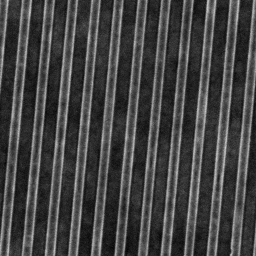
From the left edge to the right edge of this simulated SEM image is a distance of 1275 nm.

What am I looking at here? parallel lines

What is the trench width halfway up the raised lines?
72.6 nanometers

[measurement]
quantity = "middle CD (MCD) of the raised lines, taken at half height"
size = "0.044 micrometres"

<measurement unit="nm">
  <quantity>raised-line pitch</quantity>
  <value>115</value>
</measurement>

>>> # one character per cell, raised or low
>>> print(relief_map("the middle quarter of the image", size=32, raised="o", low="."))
oo....oo...oo....oo....oo....oo.
oo...oo....oo....oo....oo....oo.
oo...oo....oo....oo....oo...oo..
o....oo....oo....oo....oo...oo..
o....oo....oo....oo....oo...oo..
o....oo....oo....oo....oo...oo..
o....oo....oo....oo...oo....oo..
o....oo....oo...oo....oo....oo..
o....oo...oo....oo....oo....oo..
o....oo...oo....oo....oo....oo..
o....oo...oo....oo....oo....oo..
o....oo...oo....oo....oo....oo..
o...oo....oo....oo....oo....oo..
o...oo....oo....oo....oo...oo...
....oo....oo....oo....oo...oo...
....oo....oo....oo....oo...oo...
....oo....oo....oo....oo...oo...
....oo....oo....oo...oo....oo...
....oo....oo...oo....oo....oo...
....oo...oo....oo....oo....oo...
....oo...oo....ooo...oo....oo...
....oo...oo....oo....oo....oo...
....oo...oo....oo....oo....oo...
...oo....oo....oo....oo....oo...
...oo....oo....oo....oo...oo....
...oo....oo....oo....oo...oo....
...oo....oo....oo....oo...oo....
...oo....oo....oo....oo...oo....
...oo....oo....oo...oo....oo....
...oo....oo...oo....oo....oo....
...oo...oo....oo....oo....oo....
...oo...oo....oo....oo....oo....